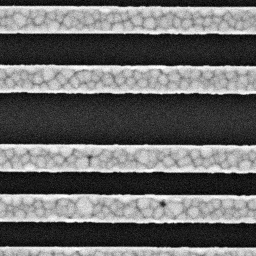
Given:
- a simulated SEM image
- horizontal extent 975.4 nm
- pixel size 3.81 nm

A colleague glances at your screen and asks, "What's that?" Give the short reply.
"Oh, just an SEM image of lines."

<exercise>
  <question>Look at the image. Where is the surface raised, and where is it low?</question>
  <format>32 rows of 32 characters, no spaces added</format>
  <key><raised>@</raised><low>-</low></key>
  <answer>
--------------------------------
@@@@@@@@@@@@@@@@@@@@@@@@@@@@@@@@
@@@@@@@@@@@@@@@@@@@@@@@@@@@@@@@@
@@@@@@@@@@@@@@@@@@@@@@@@@@@@@@@@
--------------------------------
--------------------------------
--------------------------------
--------------------------------
@@@@@@@@@@@@@@@@@@@@@@@@@@@@@@@@
@@@@@@@@@@@@@@@@@@@@@@@@@@@@@@@@
@@@@@@@@@@@@@@@@@@@@@@@@@@@@@@@@
@@-@@@@@@@@@@@@@@@@@@@@@@@@@@@@@
--------------------------------
--------------------------------
--------------------------------
--------------------------------
--------------------------------
--------------------------------
@@@@@@@@@@@@@@@@@@@@@@@@@@@@@@@@
@@@@@@@@@@@-@@@@@@@@@@@@@@@@@@@@
@@@@@@@@@@@@@@@@@@@@@@@@@@@@@@@@
--------------------------@-@@@@
--------------------------------
--------------------------------
@@@@@@@@@@@@@@@@@@@@@@@@@@@@@@--
@@@@@@@@@@@@@@@@@@@@-@@@@@@@@@@@
@@@@@@@@@@@@@@@@@@@@@@@@@@@@@@@@
@@@@@@@@@@@@@@@@@@@@@@@@@@@@@@@@
--------------------------------
--------------------------------
--------------------------------
@@@@@@@@@@@@@@@@@@@@@@@@@@@@@@@@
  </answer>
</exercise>